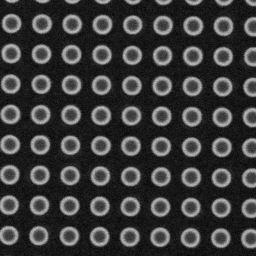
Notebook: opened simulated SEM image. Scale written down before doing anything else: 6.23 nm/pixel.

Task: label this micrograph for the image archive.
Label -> an array of small figures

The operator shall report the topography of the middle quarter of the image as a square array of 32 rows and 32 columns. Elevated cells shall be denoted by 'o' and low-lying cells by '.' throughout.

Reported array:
................................
................................
................................
oooo....ooo....ooo.....ooo.....o
oooo...ooooo...oooo...ooooo...oo
oooo...ooooo...oooo...ooooo...oo
oooo...oooo....oooo...ooooo...oo
.oo.....oo......oo.....ooo.....o
................................
................................
.oo.............................
oooo...oooo....oooo....ooo....oo
oooo...ooooo...oooo...ooooo...oo
oooo...ooooo...oooo...ooooo...oo
ooo....oooo....oooo...oooo....oo
................................
................................
................................
ooo.....ooo....ooo.....oo......o
oooo...oooo....oooo...oooo....oo
oooo...ooooo..ooooo...ooooo...oo
oooo...oooo....oooo...oooo....oo
.oo.....oo.....ooo.....ooo....oo
................................
................................
................................
ooo....oooo....ooo.....ooo....oo
oooo...oooo...ooooo...ooooo..ooo
oooo...oooo...ooooo...ooooo..ooo
ooo....oooo....oooo...oooo....oo
........................o......o
................................